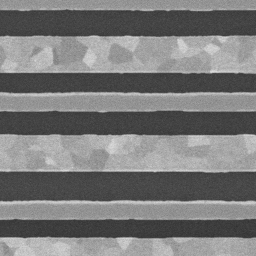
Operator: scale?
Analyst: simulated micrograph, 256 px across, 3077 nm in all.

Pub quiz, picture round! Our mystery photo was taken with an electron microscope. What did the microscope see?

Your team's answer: lines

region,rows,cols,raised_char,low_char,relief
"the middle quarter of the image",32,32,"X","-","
XXXXXXXXXXXXXXXXXXXXXXXXXXXXXXXX
XXXXXXXXXXXXXXXXXXXXXXXXXXXXXXXX
--------------------------------
--------------------------------
--------------------------------
--------------------------------
--------------------------------
XXXXXXXXXXXXXXXXXXXXX-X-X-XX-XXX
XXXXXXXXXXXXXXXXXXXXXXXXXXXXXXXX
XXXXXXXXXXXXXXXXXXXXXXXXXXXXXXXX
XXXXXXXXXXXXXXXXXXXXXXXXXXXXXXXX
XXXXXXXXXXXXXXXXXXXXXXX-------XX
--------------------------------
--------------------------------
--------------------------------
--------------------------------
--------------------------------
--------------------------------
XXXXXXXXXXXXXXXXXXXXXXXXXXXXXXXX
XXXXXXXXXXXXXXXXXXXXXXXXXXXXXXXX
XXXXXXXXXXXXXXXXXXXXXXXXXXXXXXXX
XXXXXXXXXXXXXXXXXXXXXXXXXXXXXXXX
XXXXXXXXXXXXXXXXXXXXXXXXXXXXXXXX
XXXXXXXXXXXXXXXXXXXXXXXXXXXXXXXX
XXXXXXXXXXXXXXXXXXXXXXXXXXXXXXXX
XXXXXXXXXXXXXXXXXXXXXXXXXXXXXXXX
XXXXXXXXXXXXXXXXXXXXXXXXXXXXXXXX
--------------------------------
--------------------------------
--------------------------------
--------------------------------
--------------------------------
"